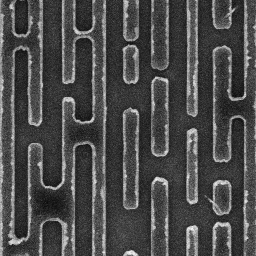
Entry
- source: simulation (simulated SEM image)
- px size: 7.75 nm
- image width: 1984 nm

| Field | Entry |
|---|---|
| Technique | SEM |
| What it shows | parallel lines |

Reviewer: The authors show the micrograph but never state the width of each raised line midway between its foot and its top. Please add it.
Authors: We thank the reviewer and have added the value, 107 nm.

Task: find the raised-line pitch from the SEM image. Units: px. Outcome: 31.2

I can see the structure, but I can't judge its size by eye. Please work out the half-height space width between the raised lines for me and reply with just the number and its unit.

135 nm